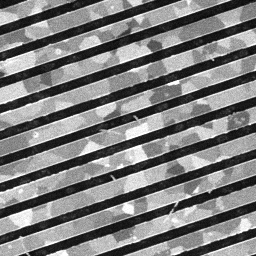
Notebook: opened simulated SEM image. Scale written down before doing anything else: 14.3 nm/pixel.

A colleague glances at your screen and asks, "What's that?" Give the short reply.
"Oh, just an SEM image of parallel lines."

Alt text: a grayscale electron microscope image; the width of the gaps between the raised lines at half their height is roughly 0.139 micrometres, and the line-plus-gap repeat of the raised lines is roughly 0.356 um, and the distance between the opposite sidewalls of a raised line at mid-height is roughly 0.214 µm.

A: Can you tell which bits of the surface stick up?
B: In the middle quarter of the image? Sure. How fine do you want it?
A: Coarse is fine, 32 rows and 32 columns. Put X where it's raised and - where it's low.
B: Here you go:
XXXXXXXXXXXX--------XXXXXXXXXXX-
XXXXXXXXX--------XXXXXXXXXXXX---
XXXXXX--------XXXXXXXXXXXX------
XXX--------XXXXXXXXXXXX-------XX
--------XXXXXXXXXXXX--------XXXX
-----XXXXXXXXXXXX-------XXXXXXXX
--XXXXXXXXXXXX-------XXXXXXXXXXX
XXXXXXXXXXX-------XXXXXXXXXXXX--
XXXXXXXX-------XXXXXXXXXXXX-----
XXXXX-------XXXXXXXXXXXX--------
XX-------XXXXXXXXXXXX--------XXX
------XXXXXXXXXXXX--------XXXXXX
----XXXXXXXXXXX--------XXXXXXXXX
-XXXXXXXXXXX--------XXXXXXXXXXXX
XXXXXXXXX--------XXXXXXXXXXXX---
XXXXXX---------XXXXXXXXXXX------
XXX---------XXXXXXXXXXX--------X
---------XXXXXXXXXXX--------XXXX
------XXXXXXXXXXX--------XXXXXXX
---XXXXXXXXXXX--------XXXXXXXXXX
XXXXXXXXXXX--------XXXXXXXXXXXX-
XXXXXXXX--------XXXXXXXXXXXX----
XXXXX--------XXXXXXXXXXXX-------
XX--------XXXXXXXXXXXX-------XXX
-------XXXXXXXXXXXX-------XXXXXX
----XXXXXXXXXXXX-------XXXXXXXXX
-XXXXXXXXXXXX-------XXXXXXXXXXXX
XXXXXXXXXX-------XXXXXXXXXXXX---
XXXXXX--------XXXXXXXXXXXX------
XXXX-------XXXXXXXXXXXX--------X
X-------XXXXXXXXXXXX--------XXXX
-X----XXXXXXXXXXX--------XXXXXXX